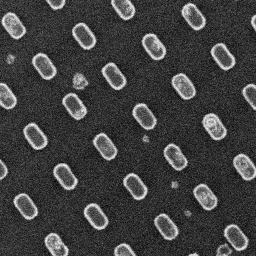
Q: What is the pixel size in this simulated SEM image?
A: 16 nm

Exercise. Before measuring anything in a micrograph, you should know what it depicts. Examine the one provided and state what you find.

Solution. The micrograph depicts a regular array of raised bodies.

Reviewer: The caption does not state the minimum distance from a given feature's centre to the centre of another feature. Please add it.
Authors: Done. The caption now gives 49.4 px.